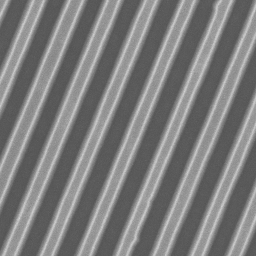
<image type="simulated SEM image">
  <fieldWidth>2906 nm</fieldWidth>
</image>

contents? parallel lines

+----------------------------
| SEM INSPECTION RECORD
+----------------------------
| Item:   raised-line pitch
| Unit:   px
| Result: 34.8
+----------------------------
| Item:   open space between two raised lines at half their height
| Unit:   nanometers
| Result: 219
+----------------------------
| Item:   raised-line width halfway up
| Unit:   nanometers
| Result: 176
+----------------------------